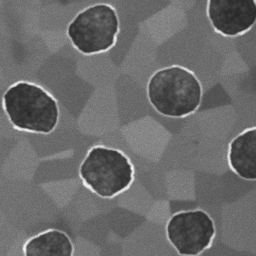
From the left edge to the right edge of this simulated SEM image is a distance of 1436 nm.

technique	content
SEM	holes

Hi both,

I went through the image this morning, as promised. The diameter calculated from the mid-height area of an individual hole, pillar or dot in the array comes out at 0.264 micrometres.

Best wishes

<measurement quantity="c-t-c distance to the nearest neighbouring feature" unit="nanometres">567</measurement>